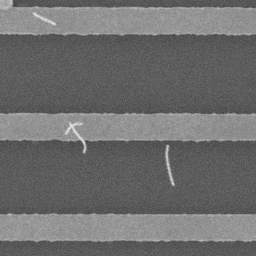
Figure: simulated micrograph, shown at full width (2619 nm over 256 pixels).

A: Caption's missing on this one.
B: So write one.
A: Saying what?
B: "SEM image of lines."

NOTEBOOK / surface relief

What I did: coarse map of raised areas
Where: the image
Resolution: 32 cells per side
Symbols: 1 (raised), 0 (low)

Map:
11000000000000000000000000000000
11111111111111111111111111111111
11111111111111111111111111111111
11111111111111111111111111111111
00000000000000000000000000000000
00000000000000000000000000000000
00000000000000000000000000000000
00000000000000000000000000000000
00000000000000000000000000000000
00000000000000000000000000000000
00000000000000000000000000000000
00000000000000000000000000000000
00000000000000000000000000000000
00000000000000000000000000000000
11111111111111111111111111111111
11111111111111111111111111111111
11111111111111111111111111111111
00001000111110010000101111110111
00000000000000000000000000000000
00000000000000000000000000000000
00000000000000000000000000000000
00000000000000000000000000000000
00000000000000000000000000000000
00000000000000000000000000000000
00000000000000000000000000000000
00000000000000000000000000000000
00000000000000000000000000000000
11111111111111111111111111111111
11111111111111111111111111111111
11111111111111111111111111111111
00000000000000000000000000000000
00000000000000000000000000000000